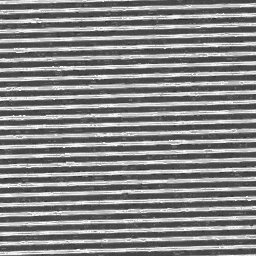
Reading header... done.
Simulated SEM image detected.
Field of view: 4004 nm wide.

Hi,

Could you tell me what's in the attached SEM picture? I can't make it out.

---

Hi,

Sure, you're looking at parallel lines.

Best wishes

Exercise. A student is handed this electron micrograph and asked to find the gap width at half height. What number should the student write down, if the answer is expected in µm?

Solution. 0.0997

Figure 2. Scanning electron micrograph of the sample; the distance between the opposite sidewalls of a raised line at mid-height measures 56.7 nm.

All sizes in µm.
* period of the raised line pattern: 0.151